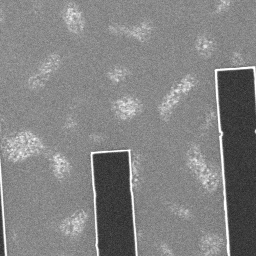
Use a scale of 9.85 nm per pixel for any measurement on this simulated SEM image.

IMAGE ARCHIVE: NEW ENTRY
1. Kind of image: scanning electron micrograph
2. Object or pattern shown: one or a few lines or trenches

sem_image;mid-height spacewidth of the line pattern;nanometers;903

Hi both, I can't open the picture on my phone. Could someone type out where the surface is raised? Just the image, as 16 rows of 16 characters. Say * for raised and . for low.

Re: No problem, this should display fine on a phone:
................
................
................
................
..............**
..............**
..............**
..............**
..............**
......**......**
......**......**
......**......**
......**......**
......**......**
......**......**
......***.....**